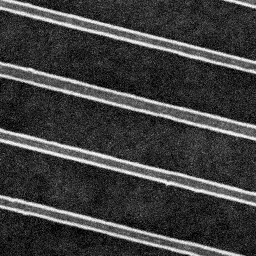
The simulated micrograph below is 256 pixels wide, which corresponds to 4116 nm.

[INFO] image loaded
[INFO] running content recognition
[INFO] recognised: one or a few lines or trenches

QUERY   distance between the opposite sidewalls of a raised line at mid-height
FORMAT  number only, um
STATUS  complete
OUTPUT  0.162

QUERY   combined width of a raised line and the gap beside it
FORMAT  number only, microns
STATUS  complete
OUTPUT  1.03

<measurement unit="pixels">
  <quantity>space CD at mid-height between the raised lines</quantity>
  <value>53.1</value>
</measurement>